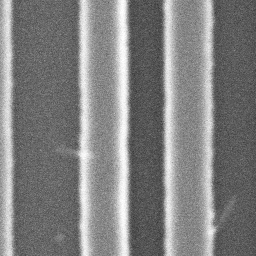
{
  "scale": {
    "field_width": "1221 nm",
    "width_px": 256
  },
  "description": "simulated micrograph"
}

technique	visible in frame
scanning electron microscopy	lines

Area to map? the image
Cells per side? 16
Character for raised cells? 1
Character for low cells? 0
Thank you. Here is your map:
1000011100111000
1000011100111000
1000011100111000
1000011100111000
1000011100111000
1000011100111000
1000011100111000
1000011100111000
1000011100111000
1000011100111000
1000011100111000
1000011100111000
1000011100111000
1000011100111000
1000011100111000
1000011100111000